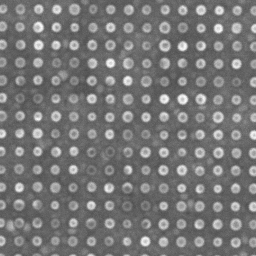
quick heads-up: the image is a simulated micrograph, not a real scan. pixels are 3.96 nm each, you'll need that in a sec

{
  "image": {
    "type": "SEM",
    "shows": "a regular array of raised bodies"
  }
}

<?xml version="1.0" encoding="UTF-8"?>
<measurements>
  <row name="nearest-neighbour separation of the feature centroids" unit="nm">69.1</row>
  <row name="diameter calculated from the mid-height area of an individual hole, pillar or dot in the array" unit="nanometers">34.9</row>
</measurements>